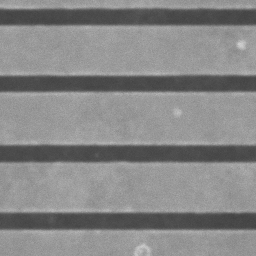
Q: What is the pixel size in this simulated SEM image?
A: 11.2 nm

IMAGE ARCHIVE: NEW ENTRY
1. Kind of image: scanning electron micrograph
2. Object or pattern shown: lines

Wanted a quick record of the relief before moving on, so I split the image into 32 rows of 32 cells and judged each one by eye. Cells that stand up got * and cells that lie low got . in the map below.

********************************
................................
................................
********************************
********************************
********************************
********************************
********************************
********************************
................................
................................
................................
********************************
********************************
********************************
********************************
********************************
********************************
................................
................................
********************************
********************************
********************************
********************************
********************************
********************************
........................**...*..
................................
................................
********************************
********************************
********************************